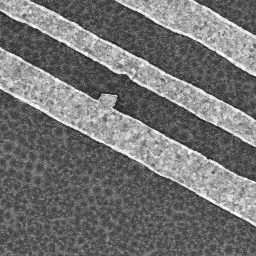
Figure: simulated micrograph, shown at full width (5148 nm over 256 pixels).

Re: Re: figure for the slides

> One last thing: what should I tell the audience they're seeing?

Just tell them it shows one or a few lines or trenches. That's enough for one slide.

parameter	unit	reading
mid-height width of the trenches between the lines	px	36.3